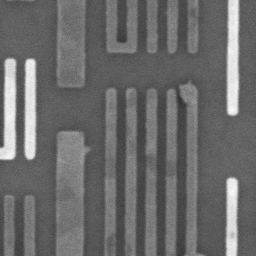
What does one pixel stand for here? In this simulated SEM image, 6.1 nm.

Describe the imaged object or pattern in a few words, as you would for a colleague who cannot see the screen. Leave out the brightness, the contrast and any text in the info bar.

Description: wiring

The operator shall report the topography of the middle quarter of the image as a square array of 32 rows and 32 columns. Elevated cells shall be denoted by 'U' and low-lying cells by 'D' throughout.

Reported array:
UUUUUDDDDDDDDDDDDDDDDDDDDDDDDDDD
UUUUUDDDDDDDDDDDDDDDDDDDDDDDDDDD
UUUUUDDDDDDDDDDDDDDDDDDDDDDDDDDD
UUUUUDDDDDDDDDDDDDDDDDDDDDDDDDDD
UUUUUDDDDDDDDDDDDDDDDDDDDDDDDDDD
UUUUUDDDDDDDDDDDDDDDDDDDDDDDDUUU
DDDDDDDDDDDUDDDDUUDDDUUDDDDDDUUU
DDDDDDDDDDDUUDDDUUDDDUUDDDUUDUUU
DDDDDDDDDDDUUDDDUUDDDUUDDDUUDDUU
DDDDDDDDDDDUUDDDUUDDDUUDDDUUDDUU
DDDDDDDDDDDUUDDDUUDDDUUDDDUUDDDU
DDDDDDDDDDDUUDDDUUDDDUUDDDUUDDDU
DDDDDDDDDDDUUDDDUUDDDUUDDDUUDDDU
DDDDDDDDDDDUUDDDUUDDDUUDDDUUDDDU
DDDDDDDDDDDUUDDDUUDDDUUDDDUUDDDU
DDDDDDDDDDDUUDDDUUDDDUUDDDUUDDDU
DDDDDDDDDDDUUDDDUUDDDUUDDDUUDDDU
UUUUUDDDDDDUUDDDUUDDDUUDDDUUDDDU
UUUUUDDDDDDUUDDDUUDDDUUDDDUUDDDU
UUUUUDDDDDDUUDDDUUDDDUUDDDUUDDDU
UUUUUDDDDDDUUDDDUUDDDUUDDDUUDDDU
UUUUUDDDDDDUUDDDUUDDDUUDDDUUDDDU
UUUUUDDDDDDUUDDDUUDDDUUDDDUUDDDU
UUUUUDDDDDDUUDDDUUDDDUUDDDUUDDDU
UUUUUDDDDDDUUDDDUUDDDUUDDDUUDDDU
UUUUUDDDDDDUUDDDUUDDDUUDDDUUDDDU
UUUUUDDDDDDUUDDDUUDDDUUDDDUUDDDU
UUUUUDDDDDDUUDDDUUDDDUUDDDUUDDDU
UUUUUDDDDDDUUDDDUUDDDUUDDDUUDDDU
UUUUUDDDDDDUUDDDUUDDDUUDDDUUDDDU
UUUUUDDDDDDUUDDDUUDDDUUDDDUUDDDU
UUUUUDDDDDDUUDDDUUDDDUUDDDUUDDDU